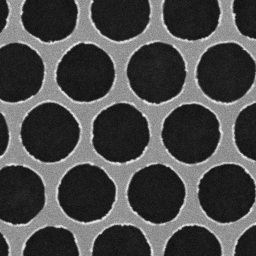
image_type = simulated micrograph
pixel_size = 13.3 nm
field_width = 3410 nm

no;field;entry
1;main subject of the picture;holes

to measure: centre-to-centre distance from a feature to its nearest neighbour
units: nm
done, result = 925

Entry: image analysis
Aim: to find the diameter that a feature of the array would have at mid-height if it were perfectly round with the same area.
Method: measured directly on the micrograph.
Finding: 778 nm